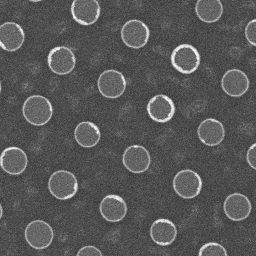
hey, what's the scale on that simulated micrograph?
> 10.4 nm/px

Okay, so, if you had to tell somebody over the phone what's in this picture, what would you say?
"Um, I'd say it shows a regular array of raised bodies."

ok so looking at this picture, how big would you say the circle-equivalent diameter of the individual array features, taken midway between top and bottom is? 283 nm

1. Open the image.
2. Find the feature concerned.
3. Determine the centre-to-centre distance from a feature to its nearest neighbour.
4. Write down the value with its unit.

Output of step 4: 573 nm